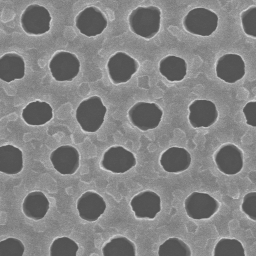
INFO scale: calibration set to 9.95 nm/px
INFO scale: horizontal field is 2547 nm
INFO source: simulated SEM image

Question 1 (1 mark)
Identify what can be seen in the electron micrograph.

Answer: a regular array of holes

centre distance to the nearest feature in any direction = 52.5 pixels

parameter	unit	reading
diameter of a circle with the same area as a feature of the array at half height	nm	283